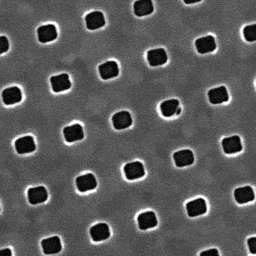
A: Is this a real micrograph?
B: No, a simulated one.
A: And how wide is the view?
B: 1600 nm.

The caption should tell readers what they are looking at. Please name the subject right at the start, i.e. a regular array of holes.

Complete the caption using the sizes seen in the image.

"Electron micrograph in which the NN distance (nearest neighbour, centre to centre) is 312 nm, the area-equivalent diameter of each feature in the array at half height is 20.2 pixels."